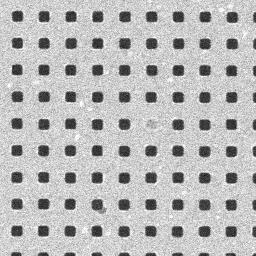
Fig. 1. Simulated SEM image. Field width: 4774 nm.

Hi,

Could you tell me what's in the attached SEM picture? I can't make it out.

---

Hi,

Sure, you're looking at a regular array of holes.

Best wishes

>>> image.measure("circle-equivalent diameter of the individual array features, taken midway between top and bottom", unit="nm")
230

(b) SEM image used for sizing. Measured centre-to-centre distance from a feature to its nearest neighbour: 493 nm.